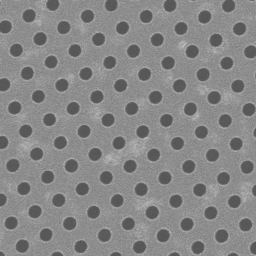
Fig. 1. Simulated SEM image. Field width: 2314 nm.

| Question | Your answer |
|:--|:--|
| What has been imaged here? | a regular array of holes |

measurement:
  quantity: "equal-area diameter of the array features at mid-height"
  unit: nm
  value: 119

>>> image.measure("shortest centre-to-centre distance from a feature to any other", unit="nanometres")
231